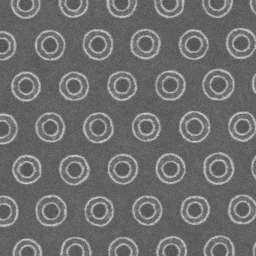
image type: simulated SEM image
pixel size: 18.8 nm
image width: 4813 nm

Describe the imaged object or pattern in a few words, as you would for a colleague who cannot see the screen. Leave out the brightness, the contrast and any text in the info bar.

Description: a regular array of ring-shaped raised bodies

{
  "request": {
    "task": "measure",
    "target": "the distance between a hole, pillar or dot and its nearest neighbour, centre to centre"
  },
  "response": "891 nm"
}